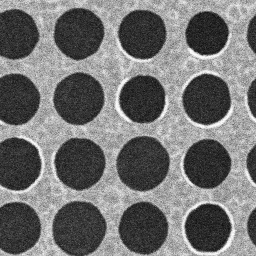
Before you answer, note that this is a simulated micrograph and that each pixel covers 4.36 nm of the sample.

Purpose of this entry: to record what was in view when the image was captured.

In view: a regular array of holes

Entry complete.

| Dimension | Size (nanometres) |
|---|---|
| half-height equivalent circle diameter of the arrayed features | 219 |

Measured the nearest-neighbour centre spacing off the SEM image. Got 63.6 px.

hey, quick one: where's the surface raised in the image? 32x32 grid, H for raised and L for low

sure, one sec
HHHHHHHHHHHHHHHHHHHHHHHHHHHHHHHH
LLLHHHHHLLLLHHHHLLLHHHHHHLLHHHHH
LLLLHHHLLLLLLHHLLLLLHHHHLLLLHHHL
LLLLLHHLLLLLLHHLLLLLLHHLLLLLLHHL
LLLLLHHLLLLLLHHLLLLLLHHLLLLLLHHL
LLLLLHHLLLLLLHHLLLLLLHHLLLLLHHHL
LLLLHHHHLLLLHHHHLLLLHHHHLLLHHHHH
HHHHHHHHHLHHHHHHHHHHHHHHHHHHHHHH
HHHHHHHHHHHHHHHHHHHHHHHHHHHHHHHH
LLLHHHHHLLLHHHHHHLLHHHHHHLLHHHHH
LLLLHHHLLLLLLHHHLLLLHHHLLLLLHHHL
LLLLLHHLLLLLLHHLLLLLLHHLLLLLLHHL
LLLLLHHLLLLLLHHLLLLLLHHLLLLLLHHL
LLLLLHHLLLLLLHHLLLLLLHHLLLLLLHHL
LLLLHHHLLLLLHHHHLLLLHHHLLLLLHHHH
HLLHHHHHHLLHHHHHHHHHHHHHHLLHHHHH
HHHHHHHHHHHHHHHHHHHHHHHHHHHHHHHH
HLLHHHHHLLLHHHHHLLLLHHHHHLLHHHHH
LLLLLHHLLLLLLHHLLLLLLHHHLLLLHHHH
LLLLLHHLLLLLLHHLLLLLLHHLLLLLLHHL
LLLLLHHLLLLLLHLLLLLLLHHLLLLLLHHL
LLLLLHHLLLLLLHHLLLLLLHHLLLLLLHHL
LLLLLHHLLLLLHHHLLLLLLHHHLLLLHHHL
HLLLHHHHHLLHHHHHLLLHHHHHHLLHHHHH
HHHHHHHHHHHHHHHHHHHHHHHHHHHHHHHH
HLLHHHHHLLLLHHHHHLLHHHHHHLLHHHHH
LLLLHHHLLLLLLHHLLLLLHHHHLLLLHHHL
LLLLLHHLLLLLLHHLLLLLLHHLLLLLLHHL
LLLLLHLLLLLLLHHLLLLLLHHLLLLLLHHL
LLLLLHHLLLLLLHHLLLLLLHHLLLLLLHHL
LLLLHHHLLLLLLHHLLLLLHHHHLLLLHHHH
HLLHHHHHLLLLHHHHHLLHHHHHHLHHHHHH